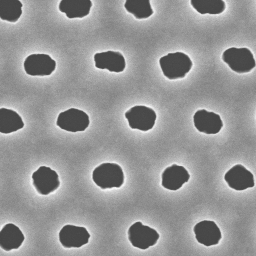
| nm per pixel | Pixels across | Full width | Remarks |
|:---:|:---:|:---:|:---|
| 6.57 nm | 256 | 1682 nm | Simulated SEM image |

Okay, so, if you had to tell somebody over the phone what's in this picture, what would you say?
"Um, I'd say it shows a regular array of holes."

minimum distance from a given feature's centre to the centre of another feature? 0.415 µm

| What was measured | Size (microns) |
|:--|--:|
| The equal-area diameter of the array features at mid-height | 0.173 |